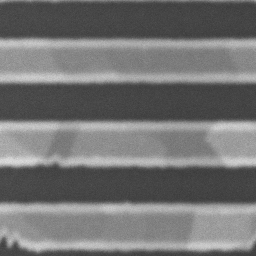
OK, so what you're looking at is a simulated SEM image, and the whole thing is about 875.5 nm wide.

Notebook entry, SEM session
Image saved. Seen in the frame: one or a few lines or trenches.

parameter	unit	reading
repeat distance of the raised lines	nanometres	284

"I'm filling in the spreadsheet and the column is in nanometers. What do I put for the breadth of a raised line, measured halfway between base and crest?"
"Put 125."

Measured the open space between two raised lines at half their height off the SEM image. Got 159 nm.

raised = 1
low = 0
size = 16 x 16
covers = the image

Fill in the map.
0000000000000000
0000000000000000
0000000000000000
1111111111111111
1111111111111111
0000000000000000
0000000000000000
0000000000000000
1111111111111111
1111111111111111
0000000000000000
0000000000000000
0000000000000000
1111111111111111
1111111111111111
0000000000000000